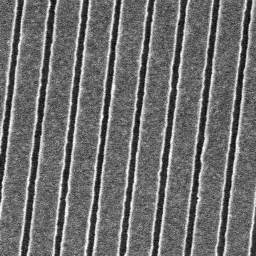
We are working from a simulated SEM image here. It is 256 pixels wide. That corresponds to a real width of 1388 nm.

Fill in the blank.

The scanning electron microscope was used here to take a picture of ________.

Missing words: parallel lines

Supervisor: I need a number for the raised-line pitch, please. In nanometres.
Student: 176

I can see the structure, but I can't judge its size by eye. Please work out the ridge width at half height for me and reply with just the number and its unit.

139 nm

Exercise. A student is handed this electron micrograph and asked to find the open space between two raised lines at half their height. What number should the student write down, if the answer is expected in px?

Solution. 7.07